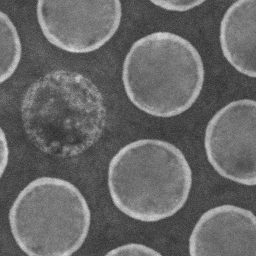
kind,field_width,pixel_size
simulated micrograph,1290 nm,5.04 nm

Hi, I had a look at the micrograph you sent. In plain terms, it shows raised bodies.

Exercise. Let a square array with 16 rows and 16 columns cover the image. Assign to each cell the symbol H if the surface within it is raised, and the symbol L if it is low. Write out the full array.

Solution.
LLHHHHHLLLLLLLLH
HLLHHHHLLLLLLLHH
HLLHHHHLLHHLLLHH
HLLLLLLLHHHHLLHH
HLLLLLLLHHHHHLLH
LLLLLLLLHHHHLLLL
LLLLLLLLLHHHLLLH
LLLLLLLLLLLLLHHH
LLLLLLLLLLLLLHHH
LLLLLLLLHHHLLHHH
LLLLLLLHHHHHLLHH
LLHHLLLHHHHHLLLL
LHHHHLLHHHHLLLLL
LHHHHLLLLHLLLHHH
LHHHHLLLLLLLHHHH
LLHHHLLLHLLLHHHH